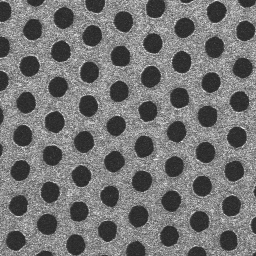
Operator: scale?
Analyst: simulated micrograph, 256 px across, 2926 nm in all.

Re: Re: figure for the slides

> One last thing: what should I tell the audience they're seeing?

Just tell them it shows a regular array of holes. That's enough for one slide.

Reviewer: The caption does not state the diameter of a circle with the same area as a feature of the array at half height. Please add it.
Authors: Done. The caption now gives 229 nanometres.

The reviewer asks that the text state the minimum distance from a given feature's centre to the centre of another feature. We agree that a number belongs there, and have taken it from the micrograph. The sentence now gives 389 nm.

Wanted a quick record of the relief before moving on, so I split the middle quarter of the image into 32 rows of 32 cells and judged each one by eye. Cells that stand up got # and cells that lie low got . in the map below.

####....#####..######.#####.....
####.....###########....####...#
####.....##########.....########
####....###########.....########
.####..######..####.....########
.###########....####...#########
.##########.....###########...##
###########.....###########....#
####....####....###########....#
####....#####.######..#####....#
####....###########....####....#
####....###########....#########
#####...###########....#########
############...####....#########
###########....#############.###
###########....###########....##
###########....###########....##
###....#####..############.....#
###....############...####....##
##.....###########....######.###
###....###########....##########
###....###########....##########
###########...####....##########
##########.....###########...###
##########.....##########.....##
####.#####.....##########.....##
##....#####...###########.....##
##.....###########...#####...###
##.....##########.....##########
##....###########.....##########
###..######.#####.....##########
##########...#####...###########